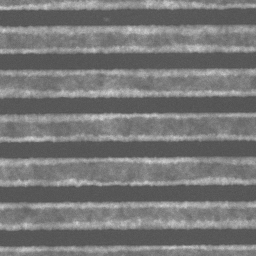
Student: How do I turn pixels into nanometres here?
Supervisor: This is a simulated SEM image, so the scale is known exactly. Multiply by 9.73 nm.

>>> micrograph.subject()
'lines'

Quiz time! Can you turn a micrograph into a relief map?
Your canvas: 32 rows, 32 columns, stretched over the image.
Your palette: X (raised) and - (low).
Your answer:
XXXXXXXXXXXXXXXXXXXXXXXXXXXXXXXX
--------------------------------
--------------------------------
XXXXXXXXXXXXXXXXXXXXXXXXXXXXXXXX
XXXXXXXXXXXXXXXXXXXXXXXXXXXXXXXX
XXXXXXXXXXXXXXXXXXXXXXXXXXXXXXXX
XXXXXXXXXXXXXX-X--XX------------
--------------------------------
--------------------------------
XXXXXXXXXXXXXXXXXXXXXXXXXXXXXXXX
XXXXXXXXXXXXXXXXXXXXXXXXXXXXXXXX
XXXXXXXXXXXXXXXXXXXXXXXXXXXXXXXX
--------------------------------
--------------------------------
-X-XXXXXXXXXXXXXXXXXXXXXXXXXXXXX
XXXXXXXXXXXXXXXXXXXXXXXXXXXXXXXX
XXXXXXXXXXXXXXXXXXXXXXXXXXXXXXXX
XXXXXXXXXXXXXXXXXXXXXXXXXX-----X
--------------------------------
--------------------------------
XXXXXXXXXXXXXXXXXXXXXXXXXXXXXXXX
XXXXXXXXXXXXXXXXXXXXXXXXXXXXXXXX
XXXXXXXXXXXXXXXXXXXXXXXXXXXXXXXX
--------------------------------
--------------------------------
XXXX-XXXXXXXXXXXXXXXXXXXXXXXXXXX
XXXXXXXXXXXXXXXXXXXXXXXXXXXXXXXX
XXXXXXXXXXXXXXXXXXXXXXXXXXXXXXXX
XXXXXXXXXXXXXXXX-------X--------
--------------------------------
--------------------------------
XXXXXXXXXXXXXXXXXXXXXXXXXXXXXXXX